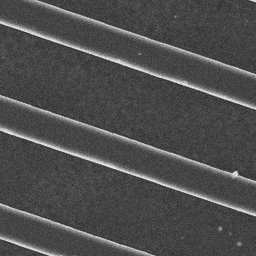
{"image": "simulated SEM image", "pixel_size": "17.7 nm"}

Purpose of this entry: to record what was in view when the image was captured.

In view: lines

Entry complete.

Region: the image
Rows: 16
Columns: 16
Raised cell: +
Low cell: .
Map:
++++............
+++++++.........
...++++++.......
......+++++++...
.........+++++++
............++++
++.............+
+++++...........
.+++++++........
....++++++......
.......++++++...
..........++++++
.............+++
++..............
+++++...........
..++++++........